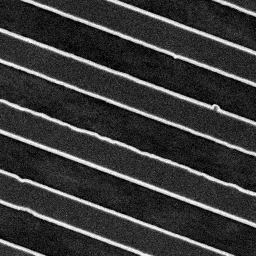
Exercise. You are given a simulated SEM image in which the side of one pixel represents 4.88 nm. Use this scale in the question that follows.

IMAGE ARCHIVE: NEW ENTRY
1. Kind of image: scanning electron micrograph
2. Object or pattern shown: one or a few lines or trenches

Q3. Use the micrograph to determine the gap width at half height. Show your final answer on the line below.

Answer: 177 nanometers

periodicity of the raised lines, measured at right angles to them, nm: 322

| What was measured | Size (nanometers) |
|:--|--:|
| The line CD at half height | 146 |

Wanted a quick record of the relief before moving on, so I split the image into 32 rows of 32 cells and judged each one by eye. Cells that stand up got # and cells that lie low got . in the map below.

....###########.............####
.......###########.............#
..........###########...........
.............###########........
##.............###########......
#####.............###########...
########.............###########
###########............#########
..###########.............######
.....###########.............###
........###########............#
..........###########...........
.............###########........
###.............###########.....
######.............###########..
########.............###########
###########.............########
...###########.............#####
......##########.............###
........###########.............
...........###########..........
#.............###########.......
###..............##########.....
######.............###########..
#########.............##########
.###########.............#######
....##########.............#####
......###########.............##
.........###########............
............##########..........
#.............###########.......
####.............###########....